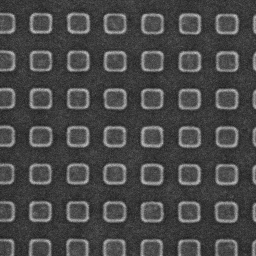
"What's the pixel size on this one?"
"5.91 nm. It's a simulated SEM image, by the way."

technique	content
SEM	a regular array of raised bodies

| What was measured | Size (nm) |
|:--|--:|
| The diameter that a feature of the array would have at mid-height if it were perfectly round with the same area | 128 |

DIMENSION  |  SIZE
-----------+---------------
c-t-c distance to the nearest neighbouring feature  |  218 nm